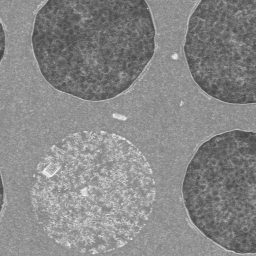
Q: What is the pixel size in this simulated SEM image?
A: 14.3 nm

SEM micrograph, holes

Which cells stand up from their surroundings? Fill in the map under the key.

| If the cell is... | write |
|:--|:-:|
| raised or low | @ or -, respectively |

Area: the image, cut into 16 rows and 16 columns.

@@@------@@@----
@@--------@@----
@@--------@@----
@@--------@@----
@@@------@@@----
@@@-----@@@@@---
@@@@@@@@@@@@@@@@
@@@@@@@@@@@@@@@@
@@@@@@@@@@@@@---
@@@@@@@@@@@@----
@@@@@@@@@@@@----
@@@@@@@@@@@-----
@@@@@@@@@@@-----
@@@@@@@@@@@@----
@@@@@@@@@@@@@---
@@@@@@@@@@@@@@--